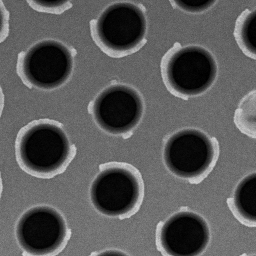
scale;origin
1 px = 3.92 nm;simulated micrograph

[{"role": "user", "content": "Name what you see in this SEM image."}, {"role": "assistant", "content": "a regular array of holes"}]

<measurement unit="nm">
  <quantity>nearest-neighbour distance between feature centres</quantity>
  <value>324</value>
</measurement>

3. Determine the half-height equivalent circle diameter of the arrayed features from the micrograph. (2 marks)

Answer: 0.171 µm